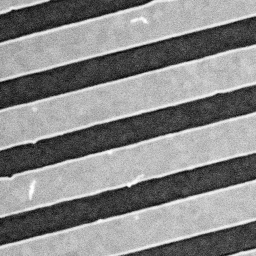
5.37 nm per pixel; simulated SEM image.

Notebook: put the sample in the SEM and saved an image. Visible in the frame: one or a few lines or trenches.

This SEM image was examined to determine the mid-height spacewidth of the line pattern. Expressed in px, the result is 28.7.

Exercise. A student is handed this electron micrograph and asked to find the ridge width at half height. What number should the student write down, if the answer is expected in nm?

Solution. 200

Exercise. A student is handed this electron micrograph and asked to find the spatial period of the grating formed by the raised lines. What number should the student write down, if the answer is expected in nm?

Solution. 354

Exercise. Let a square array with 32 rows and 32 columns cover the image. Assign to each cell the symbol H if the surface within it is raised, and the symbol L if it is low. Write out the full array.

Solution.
HHHHLLLLLLLLLLLLLLHHHHHHHHHHHHHH
LLLLLLLLLLLLLLLHHHHHHHHHHHHHHHHH
LLLLLLLLLLLHHHHHHHHHHHHHHHHHHHLL
LLLLLLLHHHHHHHHHHHHHHHHHHHLLLLLL
LLLHHHHHHHHHHHHHHHHHHHLLLLLLLLLL
HHHHHHHHHHHHHHHHHHLLLLLLLLLLLLLL
HHHHHHHHHHHHHHLLLLLLLLLLLLLLHHHH
HHHHHHHHHHLLLLLLLLLLLLLLLHHHHHHH
HHHHHHLLLLLLLLLLLLLLLHHHHHHHHHHH
HHLLLLLLLLLLLLLLLHHHHHHHHHHHHHHH
LLLLLLLLLLLLLHHHHHHHHHHHHHHHHHHH
LLLLLLLLLHHHHHHHHHHHHHHHHHHHLLLL
LLLLLHHHHHHHHHHHHHHHHHHHLLLLLLLL
LHHHHHHHHHHHHHHHHHHHLLLLLLLLLLLL
HHHHHHHHHHHHHHHHLLLLLLLLLLLLLLLH
HHHHHHHHHHHHLLLLLLLLLLLLLLLHHHHH
HHHHHHHHLLLLLLLLLLLLLLLHHHHHHHHH
HHHHHLLLLLLLLLLLLLLHHHHHHHHHHHHH
HLLLLLLLLLLLLLLHHHHHHHHHHHHHHHHH
LLLLLLLLLLLHHHHHHHHHHHHHHHHHHHLL
LLLLLLLHHHHHHHHHHHHHHHHHHHLLLLLL
LLLHHHHHHHHHHHHHHHHHHHLLLLLLLLLL
HHHHHHHHHHHHHHHHHHLLLLLLLLLLLLLL
HHHHHHHHHHHHHHHLLLLLLLLLLLLLLHHH
HHHHHHHHHHHLLLLLLLLLLLLLLHHHHHHH
HHHHHHHLLLLLLLLLLLLLLHHHHHHHHHHH
HHHLLLLLLLLLLLLLLHHHHHHHHHHHHHHH
LLLLLLLLLLLLLHHHHHHHHHHHHHHHHHHH
LLLLLLLLLHHHHHHHHHHHHHHHHHHHLLLL
LLLLLHHHHHHHHHHHHHHHHHHHLLLLLLLL
LHHHHHHHHHHHHHHHHHHHLLLLLLLLLLLL
HHHHHHHHHHHHHHHHLLLLLLLLLLLLLLHH